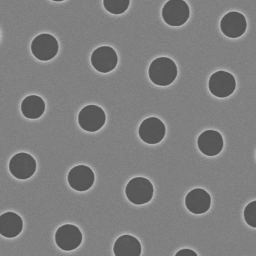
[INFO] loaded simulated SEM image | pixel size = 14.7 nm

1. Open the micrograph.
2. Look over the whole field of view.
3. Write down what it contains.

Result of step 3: a regular array of holes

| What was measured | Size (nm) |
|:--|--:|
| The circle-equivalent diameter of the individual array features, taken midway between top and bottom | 395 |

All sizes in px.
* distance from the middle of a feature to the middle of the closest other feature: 59.7